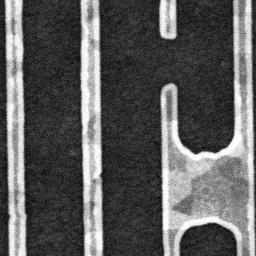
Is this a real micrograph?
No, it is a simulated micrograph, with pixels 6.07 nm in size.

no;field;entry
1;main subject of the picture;one or a few lines or trenches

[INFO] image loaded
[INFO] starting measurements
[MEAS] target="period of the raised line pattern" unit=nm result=460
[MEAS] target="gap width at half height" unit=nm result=384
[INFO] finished